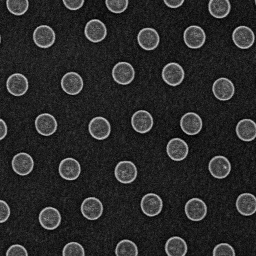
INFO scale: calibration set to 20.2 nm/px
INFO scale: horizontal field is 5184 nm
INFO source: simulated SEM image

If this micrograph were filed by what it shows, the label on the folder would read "a regular array of raised bodies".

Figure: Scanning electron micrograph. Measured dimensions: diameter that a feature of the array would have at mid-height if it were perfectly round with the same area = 0.442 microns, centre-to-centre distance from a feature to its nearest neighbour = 878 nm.